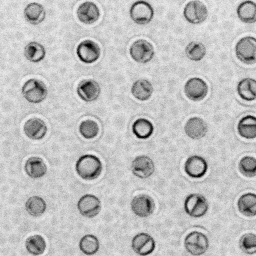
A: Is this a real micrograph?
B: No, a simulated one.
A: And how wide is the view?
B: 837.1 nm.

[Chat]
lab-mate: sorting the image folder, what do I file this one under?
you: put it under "a regular array of holes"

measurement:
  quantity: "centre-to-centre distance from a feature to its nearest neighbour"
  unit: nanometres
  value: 126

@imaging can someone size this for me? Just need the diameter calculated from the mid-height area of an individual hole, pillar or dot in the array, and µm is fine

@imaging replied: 0.0715